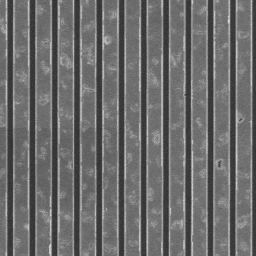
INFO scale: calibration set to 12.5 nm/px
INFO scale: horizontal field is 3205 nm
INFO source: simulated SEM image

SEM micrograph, parallel lines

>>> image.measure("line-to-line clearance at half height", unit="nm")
84.5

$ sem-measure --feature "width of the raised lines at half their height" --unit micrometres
0.191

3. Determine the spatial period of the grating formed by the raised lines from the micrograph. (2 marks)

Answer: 279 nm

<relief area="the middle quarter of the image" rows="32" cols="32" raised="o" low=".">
o...oooo..ooo..oooo..ooo..oooo..
oo..oooo..ooo..oooo..ooo..oooo..
oo..oooo..ooo..oooo..ooo..oooo..
oo..oooo..ooo..oooo..ooo..oooo..
oo..oooo..ooo..oooo..ooo..oooo..
oo..oooo..ooo..oooo..ooo..oooo..
oo..oooo..ooo..oooo..ooo..oooo..
oo..oooo..ooo..oooo..ooo..oooo..
oo..oooo..ooo..oooo..ooo..oooo..
oo..oooo..ooo..oooo..ooo..oooo..
oo..oooo..ooo..oooo..ooo..oooo..
oo..oooo..ooo..oooo..ooo..oooo..
oo..oooo..ooo..oooo..ooo..oooo..
oo..oooo..ooo..oooo..ooo..oooo..
oo..oooo..ooo..oooo..ooo..oooo..
oo..oooo..ooo..oooo..ooo..oooo..
oo..oooo..ooo..oooo..ooo..oooo..
oo..oooo..ooo..oooo..ooo..oooo..
oo..oooo..ooo..oooo..ooo..oooo..
oo..oooo..ooo..oooo..ooo..oooo..
oo..oooo..ooo..oooo..ooo..oooo..
oo..oooo..ooo..oooo..ooo..oooo..
oo..oooo..ooo..oooo..ooo..oooo..
oo..oooo..ooo..oooo..ooo..oooo..
oo..oooo..ooo..oooo..ooo..oooo..
oo..oooo..ooo..oooo..ooo..oooo..
oo..oooo..ooo..oooo..ooo..oooo..
oo..oooo..ooo..oooo..ooo..oooo..
oo..oooo..ooo..oooo..oooo.oooo..
oo..oooo..ooo..oooo..oooo.oooo..
oo..oooo..ooo..oooo..oooo.oooo..
oo..oooo..ooo..oooo..ooo..oooo..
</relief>